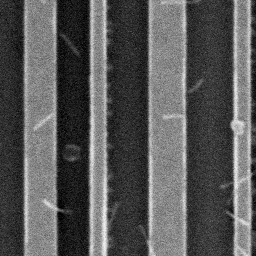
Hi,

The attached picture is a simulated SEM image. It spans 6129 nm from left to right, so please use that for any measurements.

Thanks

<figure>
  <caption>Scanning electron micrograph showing lines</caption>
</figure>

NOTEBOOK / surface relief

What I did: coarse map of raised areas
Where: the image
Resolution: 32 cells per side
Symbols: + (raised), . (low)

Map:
...++++....++......++++......++.
...++++....++......++++......++.
...++++....++......++++......++.
...++++....++......++++......++.
...++++....++......++++......++.
...++++....++......++++......++.
...++++....++......++++......++.
...++++....++......++++......++.
...++++....++......++++......++.
...++++....++......++++......++.
...++++....++......++++......++.
...++++....++......++++......++.
...++++....++......++++......++.
...++++....++......++++......++.
...++++....++......++++......++.
...++++....++......++++......++.
...++++....++......++++......++.
...++++....++......++++......++.
...++++....++......++++......++.
...++++....++......++++......++.
...++++....++......++++......++.
...++++....++......++++......++.
...++++....++......++++......++.
...++++....++......++++......++.
...++++....++......++++......++.
...++++....++......++++......++.
...++++....++......++++......++.
...++++....++......++++......++.
...++++....++......++++......++.
...++++....++......++++......++.
...++++....++......++++......++.
...++++....++......++++......++.